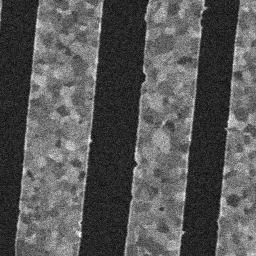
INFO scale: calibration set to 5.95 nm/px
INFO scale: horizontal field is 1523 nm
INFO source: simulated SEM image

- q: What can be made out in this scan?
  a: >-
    one or a few lines or trenches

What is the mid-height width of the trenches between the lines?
230 nm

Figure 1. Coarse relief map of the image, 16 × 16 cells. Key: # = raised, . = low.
..####...####..#
..####...####..#
..####...###...#
..####...###...#
..####...###...#
..####...###...#
..####...###..##
..####...###..##
..####...###..##
..###....###..##
.####....###..##
.####...####..##
.####...###...##
.####...###...##
.####...###...##
.####...###...##